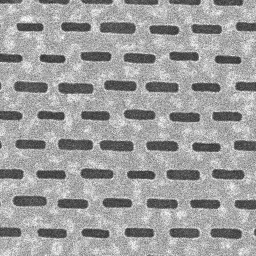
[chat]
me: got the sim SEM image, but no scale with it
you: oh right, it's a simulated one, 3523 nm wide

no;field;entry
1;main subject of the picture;a regular array of holes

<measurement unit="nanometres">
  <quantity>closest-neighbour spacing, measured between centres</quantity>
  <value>486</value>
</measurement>